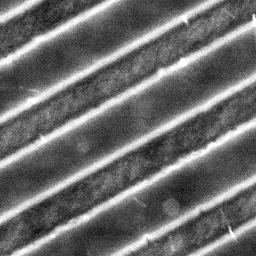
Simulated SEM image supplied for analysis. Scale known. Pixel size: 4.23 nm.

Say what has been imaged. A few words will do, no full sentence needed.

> one or a few lines or trenches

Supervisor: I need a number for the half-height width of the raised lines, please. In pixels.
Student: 51.9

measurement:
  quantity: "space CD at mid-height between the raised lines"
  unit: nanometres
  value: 150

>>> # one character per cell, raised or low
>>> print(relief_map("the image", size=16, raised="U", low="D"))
UUDDDDUUUUUUUDDD
DDDDUUUUUUUDDDDU
DDUUUUUUUDDDDDUU
DUUUUUUDDDDDUUUU
UUUUUUDDDDUUUUUU
UUUUDDDDUUUUUUUD
UUDDDDDUUUUUUDDD
DDDDDUUUUUUDDDDD
DDDUUUUUUUDDDDUU
DUUUUUUUDDDDUUUU
UUUUUUDDDDDUUUUU
UUUUDDDDDUUUUUUU
UUDDDDDUUUUUUUDD
UDDDDUUUUUUUDDDD
DDDUUUUUUUDDDDDU
DDUUUUUUDDDDDUUU